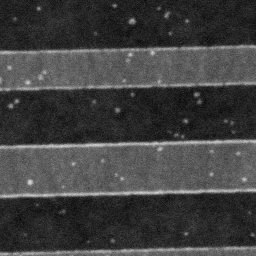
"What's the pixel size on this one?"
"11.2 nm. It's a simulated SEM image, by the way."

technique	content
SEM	lines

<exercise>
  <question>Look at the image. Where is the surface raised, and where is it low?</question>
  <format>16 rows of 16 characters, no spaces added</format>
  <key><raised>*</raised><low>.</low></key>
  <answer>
................
................
................
****************
****************
******..........
................
................
................
****************
****************
****************
................
................
................
..............**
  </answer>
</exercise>